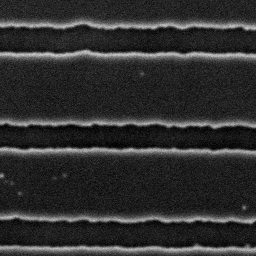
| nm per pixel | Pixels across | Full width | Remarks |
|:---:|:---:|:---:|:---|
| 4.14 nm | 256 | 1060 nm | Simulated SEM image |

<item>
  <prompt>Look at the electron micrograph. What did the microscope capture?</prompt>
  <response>lines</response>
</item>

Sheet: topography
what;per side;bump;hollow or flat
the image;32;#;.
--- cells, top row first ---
################################
################################
################################
.............#........#.......##
................................
................................
..........##....................
################################
################################
################################
################################
################################
################################
################################
################################
.#######.#######.##.############
................................
................................
#...............................
################################
################################
################################
################################
################################
################################
################################
################################
.....#####.#######..############
................................
................................
................................
################################